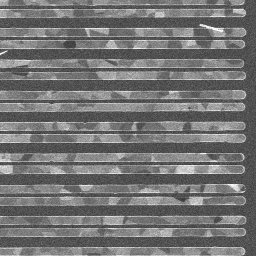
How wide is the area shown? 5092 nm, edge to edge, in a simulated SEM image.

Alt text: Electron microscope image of parallel lines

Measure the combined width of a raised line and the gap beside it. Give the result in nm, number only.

313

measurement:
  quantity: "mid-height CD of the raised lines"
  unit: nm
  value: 157